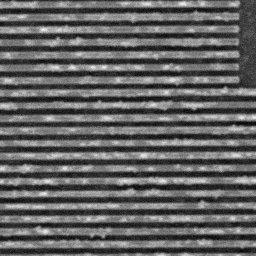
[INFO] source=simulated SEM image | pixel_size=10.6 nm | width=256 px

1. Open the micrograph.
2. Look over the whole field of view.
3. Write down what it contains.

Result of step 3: parallel lines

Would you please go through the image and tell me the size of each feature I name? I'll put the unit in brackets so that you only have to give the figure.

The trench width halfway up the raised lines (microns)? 0.0742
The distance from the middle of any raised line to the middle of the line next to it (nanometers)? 134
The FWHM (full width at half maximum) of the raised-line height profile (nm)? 64.9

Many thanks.